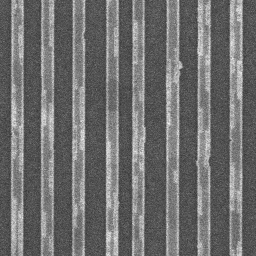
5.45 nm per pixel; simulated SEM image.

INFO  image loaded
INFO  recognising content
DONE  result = parallel lines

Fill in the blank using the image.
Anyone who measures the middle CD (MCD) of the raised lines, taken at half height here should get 0.0592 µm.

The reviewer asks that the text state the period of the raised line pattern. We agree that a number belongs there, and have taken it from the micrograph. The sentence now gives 31.2 pixels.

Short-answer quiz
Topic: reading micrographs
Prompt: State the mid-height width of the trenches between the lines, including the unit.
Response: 108 nanometers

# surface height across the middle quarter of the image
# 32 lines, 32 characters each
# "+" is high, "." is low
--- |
..+++......++....+++......+++...
..+++......++....+++......+++...
..+++......++....+++......+++...
..+++......++....+++......++....
..+++......++....+++......++....
..+++......++....+++......++....
..+++......++....+++......++....
..+++......++....+++......++....
..+++......++....+++......++....
..+++......++....+++......++....
..+++......++....+++......++....
..+++......++....+++......++....
..+++......++....+++......++....
..+++......++....+++......++....
..+++......++....+++......++....
..+++......++....+++......++....
..+++......++....+++......++....
..+++......++....+++......++....
..+++......++....+++......++....
..+++......++....+++......++....
..+++......++....+++......++....
..+++......++....+++......++....
..+++......++....+++......++....
..+++......++....+++......++....
..+++......++....+++......++....
..+++......++....+++......++....
..+++......++....+++......++....
..+++......++....+++......++....
..+++......++....+++......++....
..+++......++....+++......++....
..+++......++....+++......++....
..+++......++....+++......++....